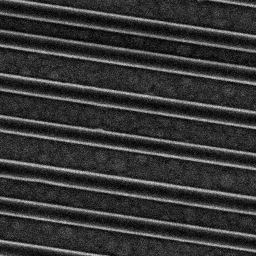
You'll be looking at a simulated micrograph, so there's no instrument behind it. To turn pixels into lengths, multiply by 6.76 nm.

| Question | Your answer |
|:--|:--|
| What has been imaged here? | parallel lines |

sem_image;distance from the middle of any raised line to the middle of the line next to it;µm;0.268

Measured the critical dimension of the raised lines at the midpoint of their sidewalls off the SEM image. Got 106 nanometers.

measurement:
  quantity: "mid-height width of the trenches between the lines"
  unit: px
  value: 25.6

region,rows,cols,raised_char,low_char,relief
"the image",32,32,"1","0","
11111000000000000000000000000011
11111111111100000000000000000000
00000011111111111110000000000000
00000000000011111111111110000000
11111000000000000001111111111111
11111111111000000000000000111111
00000111111111111100000000000000
00000000000111111111111110000000
00000000000000000011111111111110
11000000000000000000000001111111
11111111000000000000000000000000
00111111111111100000000000000000
00000000111111111111110000000000
00000000000000011111111111110000
00000000000000000000001111111111
11111110000000000000000000001111
01111111111110000000000000000000
00000000111111111111000000000000
00000000000000111111111111100000
00000000000000000000011111111111
11110000000000000000000000001111
11111111110000000000000000000000
00001111111111111000000000000000
00000000001111111111111100000000
00000000000000000111111111111100
11111000000000000000000111111111
11111111111100000000000000000011
00000111111111111110000000000000
00000000000011111111111110000000
00000000000000000001111111111111
11100000000000000000000001111111
11111111110000000000000000000000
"